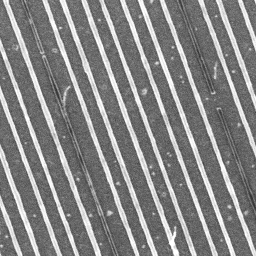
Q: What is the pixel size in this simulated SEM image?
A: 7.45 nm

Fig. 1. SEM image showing parallel lines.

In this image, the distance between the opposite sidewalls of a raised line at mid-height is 3.41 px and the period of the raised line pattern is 136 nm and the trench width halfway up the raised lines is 103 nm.